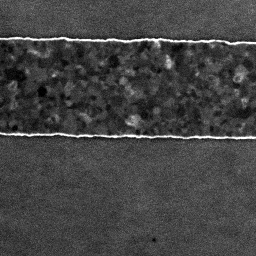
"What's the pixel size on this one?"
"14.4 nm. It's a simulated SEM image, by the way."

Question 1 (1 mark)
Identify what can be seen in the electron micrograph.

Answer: one or a few lines or trenches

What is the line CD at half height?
1400 nm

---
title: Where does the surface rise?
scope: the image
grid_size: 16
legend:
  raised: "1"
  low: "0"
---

0000000000000000
0000000000000000
1111110000000000
1111111111111111
1111111111111111
1111111111111111
1111111111111111
1111111111111111
0000101111111111
0000000000000000
0000000000000000
0000000000000000
0000000000000000
0000000000000000
0000000000000000
0000000000000000